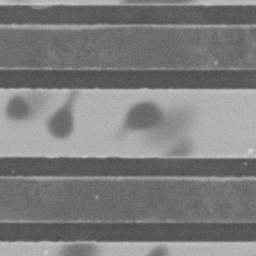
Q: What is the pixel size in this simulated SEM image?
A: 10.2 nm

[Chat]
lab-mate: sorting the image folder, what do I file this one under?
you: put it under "lines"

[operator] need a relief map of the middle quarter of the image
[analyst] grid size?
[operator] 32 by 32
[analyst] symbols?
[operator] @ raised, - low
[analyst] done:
@@@@@@@@@@@@@@@@@@@@@@@@@@@@@@@@
--------------------------------
--------------------------------
--------------------------------
--------------------------------
--------------------------------
@@@@@@@@@@@@@@@@@@@@@@@@@@@@@@@@
@@@@@@@@@@@@@@@@@@@@@@@@@@@@@@@@
@@@@@@@@@@@@@@@@@@@@@@@@@@@@@@@@
@@@@@@@@@@@@@@@@@@@@@@@@@@@@@@@@
@@@@@@@@@@@@@@@@@@@@@@@@@@@@@@@@
@@@@@@@@@@@@@@@@@@@@@@@@@@@@@@@@
@@@@@@@@@@@@@@@@@@@@@@@@@@@@@@@@
@@@@@@@@@@@@@@@@@@@@@@@@@@@@@@@@
@@@@@@@@@@@@@@@@@@@@@@@@@@@@@@@@
@@@@@@@@@@@@@@@@@@@@@@@@@@@@@@@@
@@@@@@@@@@@@@@@@@@@@@@@@@@@@@@@@
@@@@@@@@@@@@@@@@@@@@@@@@@@@@@@@@
@@@@@@@@@@@@@@@@@@@@@@@@@@@@@@@@
@@@@@@@@@@@@@@@@@@@@@@@@@@@@@@@@
@@@@@@@@@@@@@@@@@@@@@@@@@@@@@@@@
@@@@@@@@@@@@@@@@@@@@@@@@@@@@@@@@
@@@@@@@@@@@@@@@@@@@@@@@@@@@@@@@@
--------------------------------
--------------------------------
--------------------------------
--------------------------------
--------------------------------
--------------------------------
@@@@@@@@@@@@@@@@@@@@@@@@@@@@@@@@
@@@@@@@@@@@@@@@@@@@@@@@@@@@@@@@@
@@@@@@@@@@@@@@@@@@@@@@@@@@@@@@@@